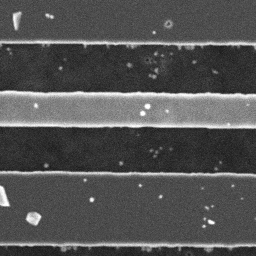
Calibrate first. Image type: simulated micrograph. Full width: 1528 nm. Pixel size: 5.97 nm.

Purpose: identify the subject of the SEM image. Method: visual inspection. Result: lines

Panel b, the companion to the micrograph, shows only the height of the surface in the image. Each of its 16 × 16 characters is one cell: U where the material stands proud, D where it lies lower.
UUUUUUUUUUUUUUUU
UUUUUUUUUUUUUUUU
UUUUUUUUUUUUUUUU
DDDDDDDDDDDDDDDD
DDDDDDDDDDDDDDDD
DDDDDDDDDDDDDDDD
UUUUUUUUUUUUUUUU
UUUUUUUUUUUUUUUU
DDDDDDDDDDDDDDDD
DDDDDDDDDDDDDDDD
DDDDDDDDDDDDDDDD
UUUUUUUUUUUUUUUU
UUUUUUUUUUUUUUUU
UUUUUUUUUUUUUUUU
UUUUUUUUUUUUUUUU
DDDDDDDDDDDDDDDD